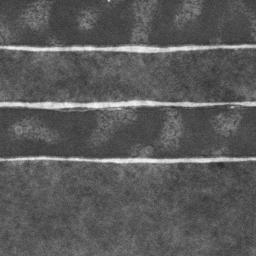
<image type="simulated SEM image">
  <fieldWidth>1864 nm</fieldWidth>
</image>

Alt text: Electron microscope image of one or a few lines or trenches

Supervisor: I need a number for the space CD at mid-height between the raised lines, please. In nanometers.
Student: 394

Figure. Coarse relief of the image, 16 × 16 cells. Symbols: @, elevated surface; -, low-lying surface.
----------------
----------------
----------------
@@@@@@@@@@@@@@@@
@@@@@@@@@@@@@@@@
@@@@@@@@@@@@@@@@
@@@@@@@@--@@@@-@
----------------
----------------
----------------
@@@@@@@@@@@@@@@@
@@@@@@@@@@@@@@@@
@@@@@@@@@@@@@@@@
@@@@@@@@@@@@@@@@
@@@@@@@@@@@@@@@@
@@@@@@@@@@@@@@@@